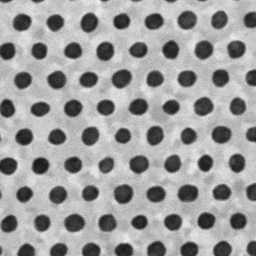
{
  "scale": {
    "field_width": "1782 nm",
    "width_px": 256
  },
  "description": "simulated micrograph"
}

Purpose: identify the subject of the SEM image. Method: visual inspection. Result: a regular array of holes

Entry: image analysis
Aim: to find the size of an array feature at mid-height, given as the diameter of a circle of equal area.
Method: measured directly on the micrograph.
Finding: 131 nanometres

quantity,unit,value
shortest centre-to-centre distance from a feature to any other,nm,224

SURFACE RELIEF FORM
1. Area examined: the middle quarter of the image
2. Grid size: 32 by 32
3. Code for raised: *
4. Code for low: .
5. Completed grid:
********************************
**************..******..******.*
****....****.....****....****...
.***.....***.....****....***....
.***....****.....***.....***....
****....****....*****...*****...
********************************
********************************
********************************
....*****...*****....****....***
.....***.....***.....****....***
.....***.....***.....****....***
....*****...*****...******..****
********************************
********************************
******..**************..********
*****....****...*****....*****..
.***.....****....***.....****...
.***.....***.....***.....****...
*****...*****...*****...*****...
*****..***************.*********
********************************
***************************.****
*...******..*****....*****...***
.....****....***.....****....***
.....***.....***.....****....***
....*****...*****....****....***
**.***************.*************
********************************
********************************
******..*****....*****..*****...
.***.....***.....****....****...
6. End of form